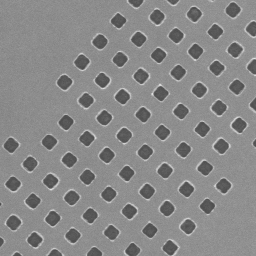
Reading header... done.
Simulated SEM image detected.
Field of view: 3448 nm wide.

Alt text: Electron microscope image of a regular array of holes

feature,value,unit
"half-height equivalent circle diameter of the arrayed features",14.5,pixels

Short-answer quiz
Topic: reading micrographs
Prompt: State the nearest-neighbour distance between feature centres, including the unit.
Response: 0.354 micrometres